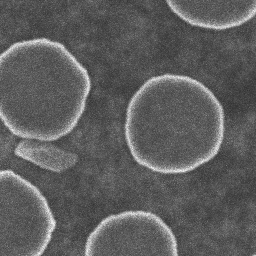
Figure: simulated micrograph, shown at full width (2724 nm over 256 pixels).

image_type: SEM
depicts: raised bodies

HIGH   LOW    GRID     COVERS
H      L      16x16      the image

LLLLLLLLLLLHHHHH
LLLLLLLLLLLLHHHL
LLLLLLLLLLLLLLLL
HHHHLLLLLLLLLLLL
HHHHHLLLLLLLLLLL
HHHHHHLLLHHHHLLL
HHHHHLLLHHHHHHLL
HHHHHLLLHHHHHHLL
LHHHLLLLHHHHHHLL
LHHLLLLLHHHHHLLL
LLLLLLLLLLHHLLLL
HHLLLLLLLLLLLLLL
HHHLLLLLLLLLLLLL
HHHLLLLHHHLLLLLL
HHHLLLHHHHHLLLLL
HHHLLHHHHHHLLLLL